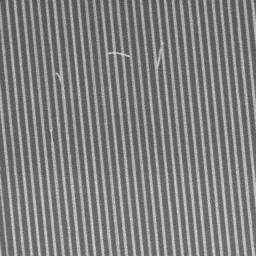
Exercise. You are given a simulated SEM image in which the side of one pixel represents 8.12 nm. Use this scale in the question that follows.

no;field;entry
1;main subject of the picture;parallel lines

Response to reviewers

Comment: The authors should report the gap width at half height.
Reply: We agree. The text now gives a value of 50.5 nm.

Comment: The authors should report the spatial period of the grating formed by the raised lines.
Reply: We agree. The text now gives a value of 64.1 nanometres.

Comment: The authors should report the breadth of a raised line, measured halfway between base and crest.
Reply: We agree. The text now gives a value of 0.0131 microns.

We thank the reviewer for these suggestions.